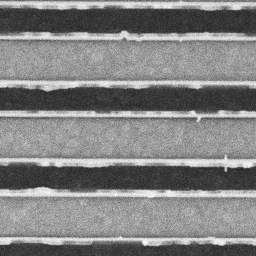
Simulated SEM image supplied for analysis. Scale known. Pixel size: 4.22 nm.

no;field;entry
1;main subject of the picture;one or a few lines or trenches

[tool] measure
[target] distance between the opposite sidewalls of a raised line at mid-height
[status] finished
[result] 148 nm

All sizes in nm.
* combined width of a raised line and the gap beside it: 331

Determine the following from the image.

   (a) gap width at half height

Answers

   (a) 184 nanometers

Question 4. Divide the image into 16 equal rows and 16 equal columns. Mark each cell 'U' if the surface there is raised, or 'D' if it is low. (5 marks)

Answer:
UUUUUUUUUUUUUUUU
UUUUUUUUUUUUUUUU
DDDDDDDDDDDDDDDD
DDDDDDDDDDDDDDDD
DDDDDDDDDDDDDDDD
UUUUUUUUUUUUUUUU
UUUUUUUUUUUUUUUU
DDDDDDDDDDDDDDDD
DDDDDDDDDDDDDDDD
DDDDDDDDDDDDDDDD
UUUUUUUUUUUUUUUU
UUUUUUUUUUUUUUUU
DDDDDDDDDDDDDDDD
DDDDDDDDDDDDDDDD
DDDDDDDDDDDDDDDD
UUUUUUUUUUUUUUUU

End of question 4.